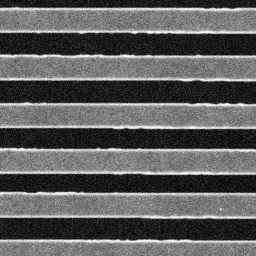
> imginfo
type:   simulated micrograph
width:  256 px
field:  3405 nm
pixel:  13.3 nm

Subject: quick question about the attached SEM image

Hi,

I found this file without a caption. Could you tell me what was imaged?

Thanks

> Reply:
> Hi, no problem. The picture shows lines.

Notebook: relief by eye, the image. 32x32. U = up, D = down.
DDDDDDDDDDDDDDDDDDDDDDDDDDDDDDDD
UUUUUUUUUUUUUUUUUUUUUUUUUUUUUUUU
UUUUUUUUUUUUUUUUUUUUUUUUUUUUUUUU
UUUUUUUUUUUUUUUUUUUUUUUUUUUUUUUU
DDDDDDDDDDDDDDDDDDDDDDDDDDDDDDDD
DDDDDDDDDDDDDDDDDDDDDDDDDDDDDDDD
DDDDDDDDDDDDDDDDDDDDDDDDDDDDDDDD
UUUUUUUUUUUUUUUUUUUUUUUUUUUUUUUU
UUUUUUUUUUUUUUUUUUUUUUUUUUUUUUUU
UUUUUUUUUUUUUUUUUUUUUUUUUUUUUUUU
DDDDDDDDDDDDDDDDDDDDDDDDDDDDDDDD
DDDDDDDDDDDDDDDDDDDDDDDDDDDDDDDD
DDDDDDDDDDDDDDDDDDDDDDDDDDDDDDDD
UUUUUUUUUUUUUUUUUUUUUUUUUUUUUUUU
UUUUUUUUUUUUUUUUUUUUUUUUUUUUUUUU
UUUUUUUUUUUUUUUUUUUUUUUUUUUUUUUU
DDDDDDDDDDDDDDDDDDDDDDDDDDDDDDDD
DDDDDDDDDDDDDDDDDDDDDDDDDDDDDDDD
DDDDDDDDDDDDDDDDDDDDDDDDDDDDDDDD
UUUUUUUUUUUUUUUUUUUUUUUUUUUUUUUU
UUUUUUUUUUUUUUUUUUUUUUUUUUUUUUUU
UUUUUUUUUUUUUUUUUUUUUUUUUUUUUUUU
DDDDDDDDDDDDDDDDDDDDDDDDDDDDDDDD
DDDDDDDDDDDDDDDDDDDDDDDDDDDDDDDD
UUUUUUUUUUUUUUUUUUUUUUUUUUUUUUUU
UUUUUUUUUUUUUUUUUUUUUUUUUUUUUUUU
UUUUUUUUUUUUUUUUUUUUUUUUUUUUUUUU
DDDDDDDDDDDDDDDDDDDDDDDDDDDDDDDD
DDDDDDDDDDDDDDDDDDDDDDDDDDDDDDDD
DDDDDDDDDDDDDDDDDDDDDDDDDDDDDDDD
UUUUUUUUUUUUUUUUUUUUUUUUUUUUUUUU
UUUUUUUUUUUUUUUUUUUUUUUUUUUUUUUU